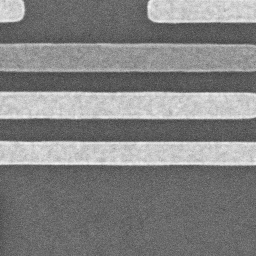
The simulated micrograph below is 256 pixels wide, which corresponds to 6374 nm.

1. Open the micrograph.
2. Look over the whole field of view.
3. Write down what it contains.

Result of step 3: wiring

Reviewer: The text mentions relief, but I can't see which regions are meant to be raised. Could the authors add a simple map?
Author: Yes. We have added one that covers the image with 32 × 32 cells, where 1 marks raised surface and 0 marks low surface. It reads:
11100000000000000001111111111111
11100000000000000001111111111111
11000000000000000001111111111111
00000000000000000000000000000000
00000000000000000000000000000000
00000000000000000000000000000000
11111111111111111111111111111111
11111111111111111111111111111111
11111111111111111111111111111111
00000000000000000000000000000000
00000000000000000000000000000000
00000000000000000000000000000000
11111111111111111111111111111111
11111111111111111111111111111111
11111111111111111111111111111111
00000000000000000000000000000000
00000000000000000000000000000000
00000000000000000000000000000000
11111111111111111111111111111111
11111111111111111111111111111111
00000000000001111111110001111111
00000000000000000000000000000000
00000000000000000000000000000000
00000000000000000000000000000000
00000000000000000000000000000000
00000000000000000000000000000000
00000000000000000000000000000000
00000000000000000000000000000000
00000000000000000000000000000000
00000000000000000000000000000000
00000000000000000000000000000000
00000000000000000000000000000000